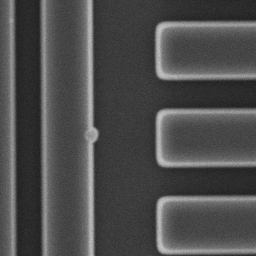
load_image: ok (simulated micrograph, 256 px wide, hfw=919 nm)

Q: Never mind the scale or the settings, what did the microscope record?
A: groups of lines, slits or small figures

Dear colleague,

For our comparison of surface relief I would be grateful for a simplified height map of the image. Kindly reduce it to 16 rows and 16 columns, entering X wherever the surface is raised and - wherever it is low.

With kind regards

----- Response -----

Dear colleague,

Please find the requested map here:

X--XXX----------
X--XXX--------XX
X--XXX----XXXXXX
X--XXX----XXXXXX
X--XXX----XXXXXX
X--XXX----------
X--XXX----------
X--XXX----XXXXXX
X--XXX----XXXXXX
X--XXX----XXXXXX
X--XXX----------
X--XXX----------
X--XXX----XXXXXX
X--XXX----XXXXXX
X--XXX----XXXXXX
X--XXX----XXXXXX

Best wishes